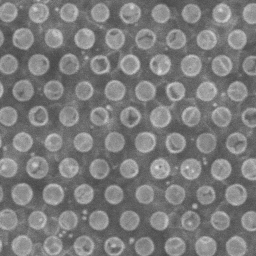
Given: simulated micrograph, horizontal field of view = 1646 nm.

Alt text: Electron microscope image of a regular array of raised bodies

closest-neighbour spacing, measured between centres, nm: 185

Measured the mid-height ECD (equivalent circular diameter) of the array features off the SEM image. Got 117 nanometres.